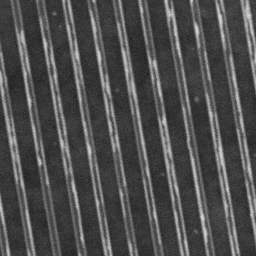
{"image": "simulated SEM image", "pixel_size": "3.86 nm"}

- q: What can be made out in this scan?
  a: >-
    parallel lines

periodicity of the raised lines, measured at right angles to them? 97.3 nanometers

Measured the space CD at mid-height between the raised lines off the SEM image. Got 0.069 um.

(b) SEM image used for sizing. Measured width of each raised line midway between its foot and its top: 27.6 nanometers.